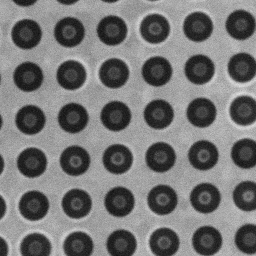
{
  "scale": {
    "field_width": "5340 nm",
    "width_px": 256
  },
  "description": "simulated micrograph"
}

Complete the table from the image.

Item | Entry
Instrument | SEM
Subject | an array of small figures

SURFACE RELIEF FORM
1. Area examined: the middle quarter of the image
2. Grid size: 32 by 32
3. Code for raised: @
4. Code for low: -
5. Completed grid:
------@@@-------@@@----@---@@@--
-@----@@---@@@---@@---@@@--@@@--
@@@---@@---@@@---@@---@@@--@@@--
-@@---@@----@---@@@@-------@@@@-
------@@@-------@@@@------@@@@@-
-----@@@@@-----@@@@@@@--@@@@@@@@
----@@@@@@@@@@@@@@@@@@@@@@@@@@@@
@@@@@@@@@@@@@@@@@@@@@@@@@@@@@@@@
@@@@@@@@@@@@@@@@@@@@@@@@@@@@@@@@
@@@@@@@@@@@----@@@@@@-----@@@@@@
-----@@@@@------@@@@-------@@@@-
------@@@--------@@@---@---@@@--
-@@---@@@---@@---@@@--@@@---@@@-
-@@@--@@@---@@---@@@---@----@@@-
-@@---@@@---@@---@@@-------@@@@-
------@@@@------@@@@@------@@@@@
-----@@@@@@----@@@@@@@@--@@@@@@@
@@@@@@@@@@@@@@@@@@@@@@@@@@@@@@@@
@@@@@@@@@@@@@@@@@@@@@@@@@@@@@@@@
@@@@@@@@@@@@@@@@@@@@@@@---@@@@@@
@@--@@@@@@@-----@@@@@------@@@@@
-----@@@@@-------@@@@-------@@@-
------@@@@---@---@@@---@@---@@@-
--@@---@@---@@@---@@---@@@--@@@-
--@@---@@@---@@---@@--------@@@-
--@@--@@@@-------@@@@------@@@@@
------@@@@------@@@@@@----@@@@@@
-----@@@@@@@---@@@@@@@@@@@@@@@@@
@@@@@@@@@@@@@@@@@@@@@@@@@@@@@@@@
@@@@@@@@@@@@@@@@@@@@@@@@@@@@@@@@
@@@@@@@@@@@@@-@@@@@@@@@---@@@@@@
@----@@@@@@-----@@@@@@------@@@@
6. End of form